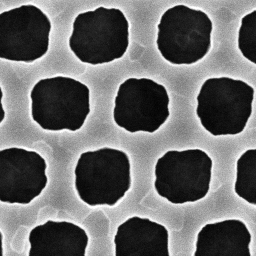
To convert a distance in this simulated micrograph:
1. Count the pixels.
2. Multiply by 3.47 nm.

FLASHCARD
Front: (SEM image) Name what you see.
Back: holes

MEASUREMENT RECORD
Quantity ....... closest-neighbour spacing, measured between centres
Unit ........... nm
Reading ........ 280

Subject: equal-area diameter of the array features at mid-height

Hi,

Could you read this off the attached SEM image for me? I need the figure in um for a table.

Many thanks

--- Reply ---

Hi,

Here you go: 0.201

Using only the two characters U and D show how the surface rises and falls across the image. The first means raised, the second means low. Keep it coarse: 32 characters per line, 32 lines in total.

UUUUUUUUUUUUUUUUUUUUUUUUUUUUUUUU
UDDDDUUUUUUDDDDUUUUUUDDDDUUUUUUU
DDDDDDUUUDDDDDDDUUUUDDDDDDUUUUDD
DDDDDDUUUDDDDDDDUUUUDDDDDDUUUUDD
DDDDDDUUUDDDDDDDUUUUDDDDDDUUUUDD
DDDDDDUUUDDDDDDDUUUUDDDDDDUUUUDD
DDDDDDUUUDDDDDDDUUUUDDDDDDUUUUDD
UDDDUUUUUUDDDDUUUUUUUDDDDUUUUUUD
UUUUUUUUUUUUUUUUUUUUUUUUUUUUUUUU
UUUUUUUUUUUUUUUUUUUUUUUUUUUUUUUU
UUUUUDDDDDUUUUUDDDDDUUUUUDDDDDDU
UUUUDDDDDDDUUUUDDDDDDUUUUDDDDDDD
UUUUDDDDDDDUUUDDDDDDDUUUUDDDDDDD
UUUUDDDDDDDUUUDDDDDDDUUUUDDDDDDU
DUUUDDDDDDDUUUDDDDDDDUUUUDDDDDDU
UUUUUDDDDDUUUUUDDDDDUUUUUDDDDDDU
UUUUUUUUUUUUUUUUUUDUUUUUUUDDDDUU
UUUUUUUUUUUUUUUUUUUUUUUUUUUUUUUU
UDDUUUUUUUUUUUUUUUUUUUUUUUUUUUUU
DDDDDUUUUUDDDDDDUUUUDDDDDDUUUUDD
DDDDDDUUUUDDDDDDUUUUDDDDDDDUUUDD
DDDDDDUUUDDDDDDDUUUDDDDDDDUUUUDD
DDDDDDUUUDDDDDDDUUUUDDDDDDUUUUDD
DDDDDUUUUUDDDDDDUUUUDDDDDDUUUDDD
DDDDDUUUUUDDDDDUUUUUDDDDDDUUUUDD
UUUUUUUUUUUDDDUUUUUUUUUUUUUUUUUU
UUUUUUUUUUUUUUUUUUUUUUUUUUUUUUUU
UUUUUUUUUUUUUUUUDDDUUUUUUUUUDDUU
UUUUDDDDDDUUUUUDDDDDDUUUUDDDDDDU
UUUUDDDDDDDUUUDDDDDDDUUUUDDDDDDU
UUUUDDDDDDDUUUDDDDDDDUUUUDDDDDDU
UUUUDDDDDDDUUUDDDDDDDUUUDDDDDDDU